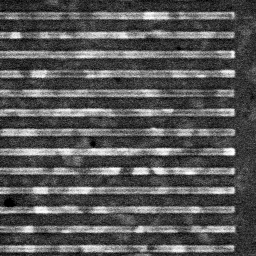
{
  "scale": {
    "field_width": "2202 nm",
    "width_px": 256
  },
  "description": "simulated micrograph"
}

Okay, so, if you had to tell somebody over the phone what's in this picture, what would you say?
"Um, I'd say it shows parallel lines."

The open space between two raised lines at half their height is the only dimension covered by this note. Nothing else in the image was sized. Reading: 118 nanometres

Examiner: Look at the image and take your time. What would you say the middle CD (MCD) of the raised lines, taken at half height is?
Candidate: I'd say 52.7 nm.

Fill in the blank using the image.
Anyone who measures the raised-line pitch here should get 167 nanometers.